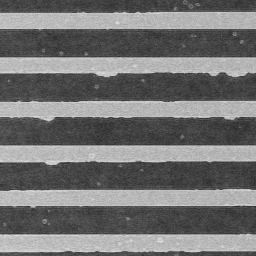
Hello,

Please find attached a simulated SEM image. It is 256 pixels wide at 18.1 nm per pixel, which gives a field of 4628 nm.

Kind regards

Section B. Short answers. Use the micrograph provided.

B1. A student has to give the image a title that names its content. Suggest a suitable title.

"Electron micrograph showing lines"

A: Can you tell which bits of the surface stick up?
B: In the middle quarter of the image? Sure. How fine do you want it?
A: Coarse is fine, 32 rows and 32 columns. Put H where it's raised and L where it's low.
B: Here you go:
HHHHHHHHHHHHHHHHHHHHHHHHHHHHHHHH
HHHHHHHHHHHHHHHHHHHHHHHHHHHHHHHH
LLLLLLLLLHHHLLLLLLLLLLLLLLLLLLLL
LLLLLLLLLLLLLLLLLLLLLLLLLLLLLLLL
LLLLLLLLLLLLLLLLLLLLLLLLLLLLLLLL
LLLLLLLLLLLLLLLLLLLLLLLLLLLLLLLL
LLLLLLLLLLLLLLLLLLLLLLLLLLLLLLLL
LLLLLLLLLLLLLLLLLLLLLLLLLLLLLLLL
LLLLLLLLLLLLLLLLLLLLLLLLLLLLLLLL
LLLHHHHHHHHHHHLHHHHHHHHHHLLHHHHH
HHHHHHHHHHHHHHHHHHHHHHHHHHHHHHHH
HHHHHHHHHHHHHHHHHHHHHHHHHHHHHHHH
HHHHHHHHHHHHHHHHHHHHHHHHHHHHHHHH
LLLLLLLLLLLLLLLLLLLLLLLLLLLLLLLL
LLLLLLLLLLLLLLLLLLLLLLLLLLLLLLLL
LLLLLLLLLLLLLLLLLLLLLLLLLLLLLLLL
LLLLLLLLLLLLLLLLLLLLLLLLLLLLLLLL
LLLLLLLLLLLLLLLLLLLLLLLLLLLLLLLL
LLLLLLLLLLLLLLLLLLLLLLLLLLLLLLLL
LLLLLLLLLLLLLLLLLLLLLLLLLLLLLLLL
LLLLLLLLLLLLLLLLLLLLLLLLLLLLLLLL
HHHHHHHHHHHHHHHHHHHHHHHHHHHHHHHH
HHHHHHHHHHHHHHHHHHHHHHHHHHHHHHHH
HHHHHHHHHHHHHHHHHHHHHHHHHHHHHHHH
LLLLLLLLLLLLLLLLLLLLLLLLLLLLLLLL
LLLLLLLLLLLLLLLLLLLLLLLLLLLLLLLL
LLLLLLLLLLLLLLLLLLLLLLLLLLLLLLLL
LLLLLLLLLLLLLLLLLLLLLLLLLLLLLLLL
LLLLLLLLLLLLLLLLLLLLLLLLLLLLLLLL
LLLLLLLLLLLLLLLLLLLLLLLLLLLLLLLL
LLLLLLLLLLLLLLLLLLLLLLLLLLLLLLLL
LLLLLLLLLLLLLLLLLLLLLLLLLLLLLLLL